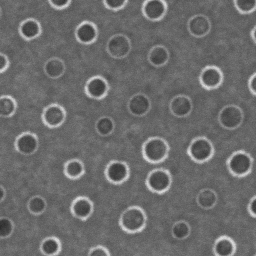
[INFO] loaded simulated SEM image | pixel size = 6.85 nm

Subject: a regular array of holes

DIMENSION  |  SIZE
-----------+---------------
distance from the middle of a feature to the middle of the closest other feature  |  0.28 microns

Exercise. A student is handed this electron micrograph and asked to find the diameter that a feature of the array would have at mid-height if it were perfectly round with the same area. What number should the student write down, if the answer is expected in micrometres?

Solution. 0.129